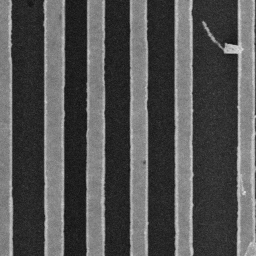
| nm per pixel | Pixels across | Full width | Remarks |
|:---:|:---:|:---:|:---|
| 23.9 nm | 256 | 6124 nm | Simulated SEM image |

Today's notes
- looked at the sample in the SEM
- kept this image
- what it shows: lines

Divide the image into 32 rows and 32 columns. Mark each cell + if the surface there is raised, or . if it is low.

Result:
+.....++...++...++....++......++
+.....++...++...++....++......++
+.....++...++...++....++......++
+.....++...++...++....++......++
+.....++...++...++....++......++
+.....++...++...++....++......++
+.....++...++...++....++....++++
+.....++...++...++....++......++
+.....++...++...++....++......++
+.....++...++...++....++......++
+.....++...++...++....++......++
+.....++...++...++....++......++
+.....++...++...++....++......++
+.....++...++...++....++......++
+.....++...++...++....++......++
+.....++...++...++....++......++
+.....++...++...++....++......++
+.....++...++...++....++......++
+.....++...++...++....++......++
+.....++...++...++....++......++
+.....++...++...++....++......++
+.....++...++...++....++......++
+.....++...++...++....++......++
+.....++...++...++....++......++
+.....++...++...++....++......++
++....++...++...++....++......++
++....++...++...++....++......++
+.....++...++...++....++......++
+.....++...++...++....++......++
+.....++...++...++....++......++
+.....++...++...++....++......++
++....++...++...++....++......++